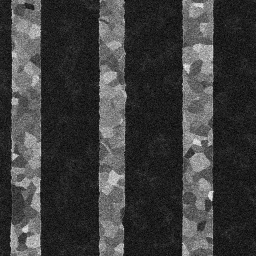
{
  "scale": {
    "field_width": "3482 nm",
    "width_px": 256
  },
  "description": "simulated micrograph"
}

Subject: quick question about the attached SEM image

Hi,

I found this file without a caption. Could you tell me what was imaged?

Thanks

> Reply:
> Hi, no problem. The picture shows one or a few lines or trenches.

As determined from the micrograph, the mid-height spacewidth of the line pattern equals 59.1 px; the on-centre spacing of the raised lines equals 1170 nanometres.